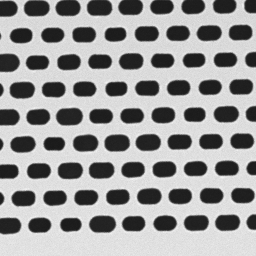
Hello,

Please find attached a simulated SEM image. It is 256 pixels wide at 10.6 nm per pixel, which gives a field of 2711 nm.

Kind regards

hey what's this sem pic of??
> a regular array of holes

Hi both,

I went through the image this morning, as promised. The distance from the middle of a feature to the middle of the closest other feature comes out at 0.328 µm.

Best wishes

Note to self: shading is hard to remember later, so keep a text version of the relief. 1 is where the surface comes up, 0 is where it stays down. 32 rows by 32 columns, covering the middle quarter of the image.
00001100000011000000110000011100
01111111111111100111111111111111
11111111111111111111111111111111
11111111111111111111111111111111
11100001111100011100000111100001
11000000110000001100000011000000
01000000110000001100000011000000
11100000111000011100000111000001
11111111111111111111111111111111
11111111111111111111111111111111
11111111111111111111111111111111
00001110000011100001110000001100
00000100000011000000110000001100
00000100000011000000110000001100
00001110000011100001111000011111
00111111111111111111111111111111
11111111111111111111111111111111
11111111111110111111101111100001
11100000110000001100000011000000
11000000010000000100000011000000
11000000010000001100000011000000
11100000111000001110000111100011
11111111111111111111111111111111
11111111111111111111111111111111
11011111000111110001111000011110
00001100000001100000110000001100
00000100000001000000110000001100
00000100000001000000110000001100
00001110000011111111111111111111
11111111111111111111111111111111
11111111111111111111111111111111
11110001111100001110000011100001